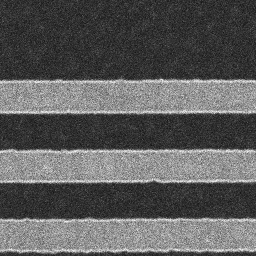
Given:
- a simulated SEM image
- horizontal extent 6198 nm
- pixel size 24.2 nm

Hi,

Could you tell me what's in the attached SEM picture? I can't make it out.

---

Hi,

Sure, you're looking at one or a few lines or trenches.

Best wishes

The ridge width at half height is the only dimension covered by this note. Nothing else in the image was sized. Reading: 947 nanometres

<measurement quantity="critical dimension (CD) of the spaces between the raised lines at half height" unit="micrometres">0.738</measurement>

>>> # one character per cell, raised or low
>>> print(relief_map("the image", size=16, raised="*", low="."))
****************
****************
****************
****************
****************
................
................
****************
****************
.*..............
................
****************
****************
****************
................
................